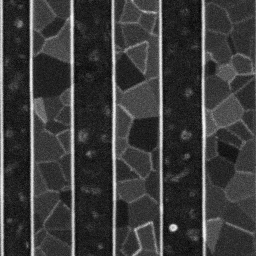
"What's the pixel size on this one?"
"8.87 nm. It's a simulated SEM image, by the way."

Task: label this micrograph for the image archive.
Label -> one or a few lines or trenches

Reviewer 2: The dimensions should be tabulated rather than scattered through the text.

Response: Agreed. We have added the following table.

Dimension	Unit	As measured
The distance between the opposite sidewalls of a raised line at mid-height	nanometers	390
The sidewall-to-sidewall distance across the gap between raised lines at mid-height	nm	360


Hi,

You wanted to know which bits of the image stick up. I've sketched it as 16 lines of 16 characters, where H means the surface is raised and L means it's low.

LLHHLLLHHHLLLHHH
LLHHHLLHHHLLLHHH
LLHHHLLHHHLLLHHH
LLHHHLLHHHLLLHHH
LLHHHLLHHHLLLHHH
LLHHHLLHHHLLLHHH
LLHHLLLHHHLLLHHH
LLHHHLLHHHLLLHHH
LLHHHLLHHHLLLHHH
LLHHHLLHHHLLLHHH
LLHHHLLHHHLLLHHH
LLHHHLLHHHLLLHHH
LLHHHLLHHHLLLHHH
LLHHHLLHHHLLLHHH
LLHHHLLHHHLLLHHH
LLHHHLLHHHLLLHHH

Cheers